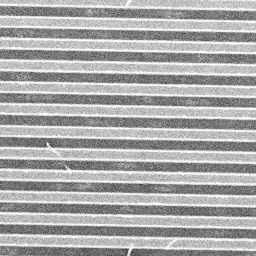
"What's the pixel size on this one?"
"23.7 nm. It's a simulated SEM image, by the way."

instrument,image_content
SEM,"parallel lines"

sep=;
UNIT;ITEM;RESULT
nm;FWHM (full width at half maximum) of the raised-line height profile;258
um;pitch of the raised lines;0.517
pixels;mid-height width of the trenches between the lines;10.9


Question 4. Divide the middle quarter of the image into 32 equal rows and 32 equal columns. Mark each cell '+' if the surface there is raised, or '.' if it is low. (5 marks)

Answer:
++++++++++++++++++++++++++++++++
++++++++++++++++++++++++++++++++
..............................++
................................
................................
++++++++++++++++++++++++++++++++
++++++++++++++++++++++++++++++++
.........+++++++++++++++++++++++
................................
................................
++++++++++++....................
++++++++++++++++++++++++++++++++
++++++++++++++++++++++++++++++++
................................
................................
................................
+++++++++++++++++++++++++++++...
++++++++++++++++++++++++++++++++
.....+++++++++...+++++++++++++++
................................
................................
++++++++........................
++++++++++++++++++++++++++++++++
++++++++++++++++++++++++++++++++
................................
................................
.+..............................
++++++++++++++++++++++++++++++++
++++++++++++++++++++++++++++++++
.............+++++++++++++++++++
................................
................................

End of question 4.